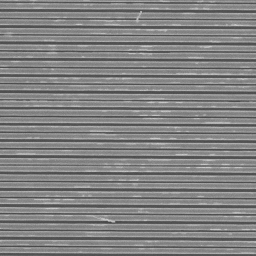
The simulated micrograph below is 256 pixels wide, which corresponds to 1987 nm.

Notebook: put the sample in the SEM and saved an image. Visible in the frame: parallel lines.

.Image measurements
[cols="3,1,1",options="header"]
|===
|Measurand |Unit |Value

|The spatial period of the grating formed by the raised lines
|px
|8.13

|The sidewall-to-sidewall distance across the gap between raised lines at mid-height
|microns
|0.0213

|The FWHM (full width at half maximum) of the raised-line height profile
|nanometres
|41.7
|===